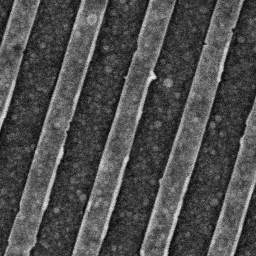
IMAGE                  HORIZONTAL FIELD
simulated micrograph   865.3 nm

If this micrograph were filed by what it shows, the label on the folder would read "one or a few lines or trenches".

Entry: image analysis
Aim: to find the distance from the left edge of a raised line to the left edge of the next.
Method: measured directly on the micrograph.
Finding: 64.5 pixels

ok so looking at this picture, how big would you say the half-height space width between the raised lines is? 134 nanometres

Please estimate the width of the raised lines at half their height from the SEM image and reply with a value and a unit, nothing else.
0.0827 micrometres